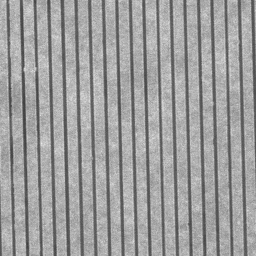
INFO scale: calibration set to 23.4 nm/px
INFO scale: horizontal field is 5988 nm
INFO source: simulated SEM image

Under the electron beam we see parallel lines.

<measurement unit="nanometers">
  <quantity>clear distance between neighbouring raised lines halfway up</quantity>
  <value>102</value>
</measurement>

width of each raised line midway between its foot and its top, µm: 0.228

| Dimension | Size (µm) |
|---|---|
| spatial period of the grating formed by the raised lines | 0.319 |